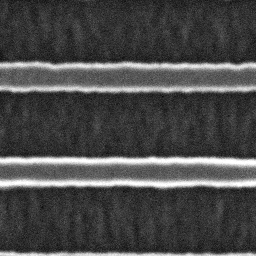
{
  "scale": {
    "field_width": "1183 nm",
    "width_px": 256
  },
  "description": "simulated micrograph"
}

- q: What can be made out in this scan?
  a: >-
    lines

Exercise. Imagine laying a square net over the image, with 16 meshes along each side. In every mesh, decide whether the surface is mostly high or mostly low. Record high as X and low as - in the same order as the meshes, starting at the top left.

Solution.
----------------
----------------
----------------
----------------
XXXXXXXXXXXXXXXX
XXXXXXXXXXXXXXXX
----------------
----------------
----------------
----------------
XXXXXXXXXXXXXXXX
XXXXXXXXXXXXXXXX
----------------
----------------
----------------
----------------